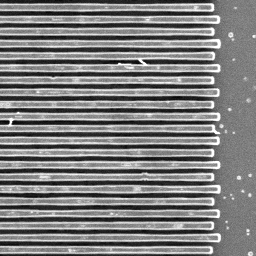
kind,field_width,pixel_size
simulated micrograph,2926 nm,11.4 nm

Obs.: parallel lines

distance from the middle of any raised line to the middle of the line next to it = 139 nanometers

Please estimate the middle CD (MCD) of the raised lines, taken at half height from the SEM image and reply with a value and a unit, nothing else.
80 nm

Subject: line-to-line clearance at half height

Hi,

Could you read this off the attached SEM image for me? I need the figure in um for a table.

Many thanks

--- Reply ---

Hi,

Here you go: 0.06